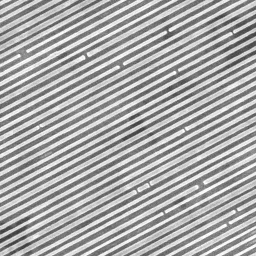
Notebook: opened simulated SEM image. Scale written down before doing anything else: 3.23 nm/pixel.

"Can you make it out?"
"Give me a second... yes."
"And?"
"parallel lines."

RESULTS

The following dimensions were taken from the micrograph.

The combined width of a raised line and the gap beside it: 25.7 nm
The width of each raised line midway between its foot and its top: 10.7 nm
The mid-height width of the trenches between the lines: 0.0136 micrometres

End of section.